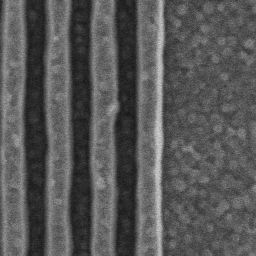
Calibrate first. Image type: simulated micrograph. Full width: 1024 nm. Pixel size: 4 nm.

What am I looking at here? parallel lines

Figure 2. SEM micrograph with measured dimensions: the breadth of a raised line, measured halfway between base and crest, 22 pixels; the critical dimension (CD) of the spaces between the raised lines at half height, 94.9 nm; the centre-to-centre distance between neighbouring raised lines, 181 nm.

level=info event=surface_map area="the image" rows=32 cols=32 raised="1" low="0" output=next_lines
01100011100011000111000000000000
01100011100011000111000000000000
01100011100111000111000000000000
11100011000111000111000000000000
11100011000111000111000000000000
11100011000111000111000000000000
11100011000111000111000000000000
11100011000111000111000000000000
11100011100111000111000000000000
11100011100111100111000000000000
11100011100011100111000000000000
11100011100011100111000000000000
11100011100011100111000000000000
11100011100011100111000000000000
11100011100011000111000000000000
11100011100011000111000000000000
11100011100011000111000000000000
11100011100111000111000000000000
11100011100111000111000000000000
11100011100111000111000000000000
11100011100111000111000000000000
11100011100111000111000000000000
11100011100011000111000000000000
11100011100011000111000000000000
11100011000011000111000000000000
11100011000011000111000000000000
11100011000011000111000000000000
11100011000011000111000000000000
11100011100011000111000000000000
11100011100011000111000000000000
11100011100111000111000000000000
11100011100111000111000000000000